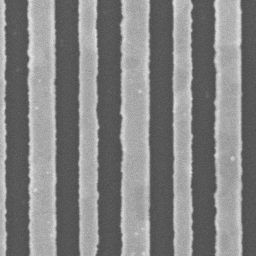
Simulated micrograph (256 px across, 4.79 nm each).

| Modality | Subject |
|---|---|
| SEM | lines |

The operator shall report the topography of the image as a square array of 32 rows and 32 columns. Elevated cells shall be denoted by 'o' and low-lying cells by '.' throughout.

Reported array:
o...ooo...oo...oooo...oo...ooo..
o..oooo...oo...oooo...oo...ooo..
o...ooo...oo...oooo...oo...ooo..
o...ooo...oo...oooo...oo...ooo..
o...ooo...oo...oooo...oo...ooo..
o...ooo...oo...oooo...oo...ooo..
o..oooo...oo...oooo...oo...ooo..
o...ooo...oo...oooo...oo...ooo..
o...ooo...oo...oooo...oo...ooo..
o...ooo...oo...oooo...oo...ooo..
o...ooo...oo...oooo...oo...ooo..
o...ooo...oo...oooo...oo...ooo..
o...ooo...oo...oooo...oo...ooo..
o...ooo...oo...oooo...oo...ooo..
o...ooo...oo...oooo...oo...ooo..
o...ooo...oo...oooo...oo...ooo..
o...ooo...oo...oooo...oo...ooo..
o...ooo...oo...oooo...oo...ooo..
o...ooo...oo...oooo...oo...ooo..
o...ooo...oo...oooo...oo...ooo..
o...ooo...oo...oooo...oo...ooo..
o...ooo...oo...oooo...oo...ooo..
o...ooo...oo...oooo...oo...ooo..
o...ooo...oo...oooo...oo...ooo..
o...ooo...oo...oooo...oo...ooo..
o...ooo...oo...oooo...oo...ooo..
o...ooo...oo...oooo...oo...ooo..
o...ooo...oo...oooo...oo...ooo..
o...ooo...oo...oooo...oo...ooo..
o...ooo...oo...oooo...oo...ooo..
o...ooo...oo...oooo...oo...ooo..
o...ooo...oo...oooo...oo...ooo..